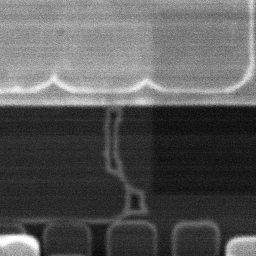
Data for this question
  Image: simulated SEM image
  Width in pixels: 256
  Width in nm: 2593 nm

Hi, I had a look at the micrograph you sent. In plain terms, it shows wiring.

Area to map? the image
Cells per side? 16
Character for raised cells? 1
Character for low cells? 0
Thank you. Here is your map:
1111111111111111
1111111111111111
1111111111111111
1111111111111111
1111111111111111
1111111111111111
0000000000000000
0000000000000000
0000000000000000
0000000000000000
0000000000000000
0000000000000000
0000000000000000
0000000000000000
0000000000000000
1100000000000011